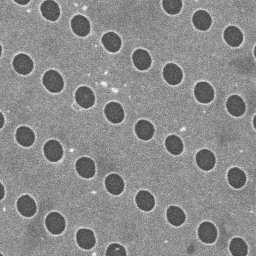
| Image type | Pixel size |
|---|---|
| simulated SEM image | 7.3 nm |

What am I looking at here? a regular array of holes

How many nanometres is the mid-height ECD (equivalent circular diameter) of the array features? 158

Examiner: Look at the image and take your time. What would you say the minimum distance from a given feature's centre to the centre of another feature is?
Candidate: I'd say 250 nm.